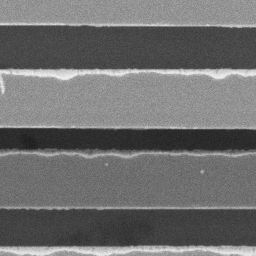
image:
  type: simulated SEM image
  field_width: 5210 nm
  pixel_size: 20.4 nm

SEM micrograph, lines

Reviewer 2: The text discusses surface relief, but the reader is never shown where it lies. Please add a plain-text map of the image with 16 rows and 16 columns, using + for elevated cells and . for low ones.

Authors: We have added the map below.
++++++++++++++++
++++++++++++++++
................
................
+....++++++++.+.
++++++++++++++++
++++++++++++++++
++++++++++++++++
................
.+..............
++++++++++++++++
++++++++++++++++
++++++++++++++++
................
................
............+...